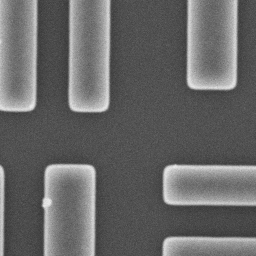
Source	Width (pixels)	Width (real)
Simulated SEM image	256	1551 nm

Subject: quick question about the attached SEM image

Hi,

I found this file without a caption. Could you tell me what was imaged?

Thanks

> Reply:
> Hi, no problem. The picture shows groups of lines, slits or small figures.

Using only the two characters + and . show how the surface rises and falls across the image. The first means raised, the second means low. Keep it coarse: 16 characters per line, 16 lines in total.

++..+++.....+++.
++..+++.....+++.
++..+++.....+++.
++..+++.....+++.
++..+++.....+++.
++..+++.....++..
++..+++.........
................
................
................
...+++.....+++++
...+++....++++++
...+++....++++++
...+++..........
...+++..........
...+++....++++++